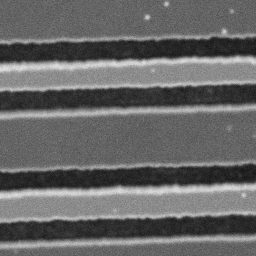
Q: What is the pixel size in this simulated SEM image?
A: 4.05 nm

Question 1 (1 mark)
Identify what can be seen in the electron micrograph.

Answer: lines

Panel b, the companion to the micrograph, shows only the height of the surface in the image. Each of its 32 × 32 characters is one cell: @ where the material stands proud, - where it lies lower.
@@@@@@@@@@@@@@@@@@@@@@@@@@@@@@@@
@@@@@@@@@@@@@@@@@@@@@@@@@@@@@@@@
@@@@@@@@@@@@@@@@@@@@@@@@@@@@@@@@
@@@@@@@@@@@@@@@@@@@@@@@@@@@@@@@@
@@@@@@@@@@@@@@@@@@@@@@@@@@@@@@@@
--------------------------------
--------------------------------
-------------------@@@@@@@@@@@@@
@@@@@@@@@@@@@@@@@@@@@@@@@@@@@@@@
@@@@@@@@@@@@@@@@@@@@@@@@@@@@@@@@
@@@@@@@@@@@@@@@@@@@@@@@@@@@@@@@-
--------------------------------
--------------------------------
------------------------@@@@@@@@
@@@@@@@@@@@@@@@@@@@@@@@@@@@@@@@@
@@@@@@@@@@@@@@@@@@@@@@@@@@@@@@@@
@@@@@@@@@@@@@@@@@@@@@@@@@@@@@@@@
@@@@@@@@@@@@@@@@@@@@@@@@@@@@@@@@
@@@@@@@@@@@@@@@@@@@@@@@@@@@@@@@@
@@@@@@@@@@@@@@@@@@@@@@@@@@@@@@@@
@@@@@@@@@@@@@@@@@@@@@@@@@@@@@@@-
@@------------------------------
--------------------------------
--------------@@-@@@@@@@@@@@@@@@
@@@@@@@@@@@@@@@@@@@@@@@@@@@@@@@@
@@@@@@@@@@@@@@@@@@@@@@@@@@@@@@@@
@@@@@@@@@@@@@@@@@@@@@@@@@@@@@@@@
@@@@@@@-@@----------------------
--------------------------------
--------------------------------
--@@@@@@@@@@@@@@@@@@@@@@@@@@@@@@
@@@@@@@@@@@@@@@@@@@@@@@@@@@@@@@@